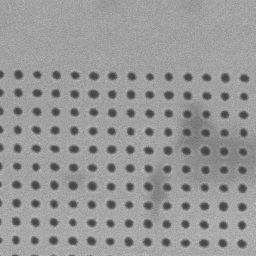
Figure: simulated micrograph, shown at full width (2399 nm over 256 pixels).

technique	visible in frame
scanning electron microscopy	a regular array of holes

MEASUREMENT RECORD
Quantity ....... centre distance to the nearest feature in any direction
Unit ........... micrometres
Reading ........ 0.17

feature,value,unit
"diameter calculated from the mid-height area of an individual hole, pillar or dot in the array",81.9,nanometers